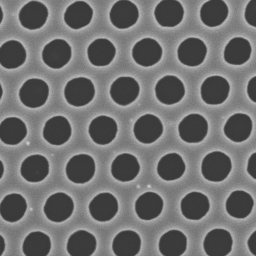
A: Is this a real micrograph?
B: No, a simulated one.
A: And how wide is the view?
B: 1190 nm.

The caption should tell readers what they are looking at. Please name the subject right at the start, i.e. a regular array of holes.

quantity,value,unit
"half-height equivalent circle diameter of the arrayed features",0.133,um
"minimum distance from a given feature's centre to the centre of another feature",0.206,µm